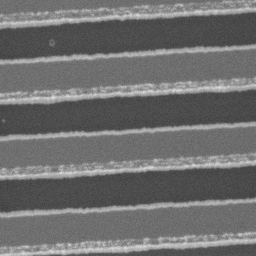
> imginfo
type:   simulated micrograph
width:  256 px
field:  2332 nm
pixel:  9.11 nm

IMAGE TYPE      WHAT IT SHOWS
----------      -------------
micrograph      lines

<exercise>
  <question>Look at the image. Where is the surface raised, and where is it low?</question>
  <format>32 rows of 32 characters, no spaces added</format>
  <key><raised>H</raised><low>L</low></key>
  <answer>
HHHHHHHHHHHHHHHHHHHHHHHHHHHHHHHH
HHHHHHHHHHHHHHHHHHHHHHHHHHHHLLLL
HHHHHHHHHHHLLLLLLLLLLLLLLLLLLLLL
LLLLLLLLLLLLLLLLLLLLLLLLLLLLLLLL
LLLLLLLLLLLLLLLLLLLLLLLLLLLLLLLL
LLLLLLLLLLLLLLLLLLLLLLLLLLLLLLLL
LLLLLLLLLLLLLLLLLLLLHHHHHHHHHHHH
LLLLLLHHHHHHHHHHHHHHHHHHHHHHHHHH
HHHHHHHHHHHHHHHHHHHHHHHHHHHHHHHH
HHHHHHHHHHHHHHHHHHHHHHHHHHHHHHHH
HHHHHHHHHHHHHHHHHHHHHHHHHHHHHHHH
HHHHHHHHHHHHHHHHHHHHHLLLLLLLLLLL
HHHHHHLLLLLLLLLLLLLLLLLLLLLLLLLL
LLLLLLLLLLLLLLLLLLLLLLLLLLLLLLLL
LLLLLLLLLLLLLLLLLLLLLLLLLLLLLLLL
LLLLLLLLLLLLLLLLLLLLLLLLLLLLLLLH
LLLLLLLLLLLLLLLLHHHHHHHHHHHHHHHH
HHHHHHHHHHHHHHHHHHHHHHHHHHHHHHHH
HHHHHHHHHHHHHHHHHHHHHHHHHHHHHHHH
HHHHHHHHHHHHHHHHHHHHHHHHHHHHHHHH
HHHHHHHHHHHHHHHHHHHHHHHHHHHHHHHL
HHHHHHHHHHHHHHLLLLLLLLLLLLLLLLLL
LLLLLLLLLLLLLLLLLLLLLLLLLLLLLLLL
LLLLLLLLLLLLLLLLLLLLLLLLLLLLLLLL
LLLLLLLLLLLLLLLLLLLLLLLLLLLLLLLL
LLLLLLLLLLLLLLLLLLLLLLLLLHHHHHHH
LLLLLLHHHHHHHHHHHHHHHHHHHHHHHHHH
HHHHHHHHHHHHHHHHHHHHHHHHHHHHHHHH
HHHHHHHHHHHHHHHHHHHHHHHHHHHHHHHH
HHHHHHHHHHHHHHHHHHHHHHHHHHHHHHHH
HHHHHHHHHHHHHHHHHHHHHHHHHHLLLLLL
HHHHHHHHHLLLLLLLLLLLLLLLLLLLLLLL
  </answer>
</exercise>